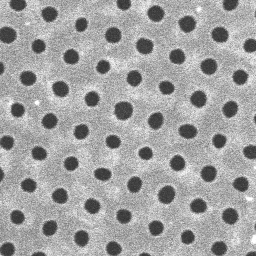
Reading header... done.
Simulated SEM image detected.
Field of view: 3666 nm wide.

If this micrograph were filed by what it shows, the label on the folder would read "a regular array of holes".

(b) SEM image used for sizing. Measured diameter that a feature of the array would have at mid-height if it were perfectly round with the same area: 0.235 microns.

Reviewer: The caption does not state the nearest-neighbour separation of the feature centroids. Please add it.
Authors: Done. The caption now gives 476 nanometers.